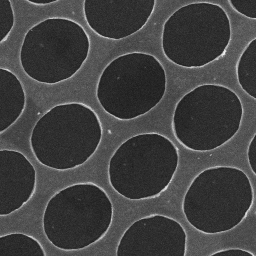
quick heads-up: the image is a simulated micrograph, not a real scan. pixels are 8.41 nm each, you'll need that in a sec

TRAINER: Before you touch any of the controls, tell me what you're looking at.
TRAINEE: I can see a regular array of holes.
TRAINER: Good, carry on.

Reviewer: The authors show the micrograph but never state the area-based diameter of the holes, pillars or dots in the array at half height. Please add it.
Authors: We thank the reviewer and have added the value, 560 nm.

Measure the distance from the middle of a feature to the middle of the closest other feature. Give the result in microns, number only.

0.683